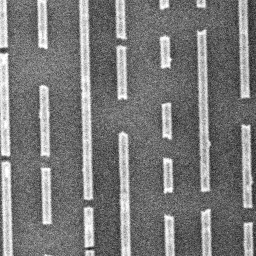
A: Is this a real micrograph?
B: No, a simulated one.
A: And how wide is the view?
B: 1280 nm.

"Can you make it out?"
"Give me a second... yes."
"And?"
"parallel lines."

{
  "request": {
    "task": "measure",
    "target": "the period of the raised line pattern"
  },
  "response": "200 nm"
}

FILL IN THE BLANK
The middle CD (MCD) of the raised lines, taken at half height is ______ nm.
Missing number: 38.1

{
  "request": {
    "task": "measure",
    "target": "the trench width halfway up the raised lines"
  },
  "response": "0.163 µm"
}